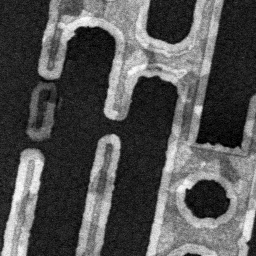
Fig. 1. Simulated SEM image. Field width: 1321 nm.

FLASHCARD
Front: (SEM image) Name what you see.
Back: one or a few lines or trenches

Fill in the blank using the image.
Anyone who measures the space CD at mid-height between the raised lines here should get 266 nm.